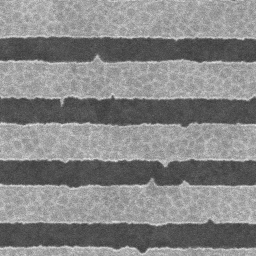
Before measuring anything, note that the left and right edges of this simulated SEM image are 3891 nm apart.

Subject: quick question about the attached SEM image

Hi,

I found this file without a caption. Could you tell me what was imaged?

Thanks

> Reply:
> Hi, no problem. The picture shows one or a few lines or trenches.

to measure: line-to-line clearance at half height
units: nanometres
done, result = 395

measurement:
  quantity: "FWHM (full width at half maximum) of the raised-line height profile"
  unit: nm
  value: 549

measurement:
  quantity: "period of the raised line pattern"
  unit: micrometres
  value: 0.942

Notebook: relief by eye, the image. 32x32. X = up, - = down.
XXXXXXXXXXXXXXXXXXXXXXXXXXXXXXXX
XXXXXXXXXXXXXXXXXXXXXXXXXXXXXXXX
XXXXXXXXXXXXXXXXXXXXXXXXXXXXXXXX
XXXXXXXXXXXXXXXXXXXXXXXXXXXXXXXX
XXXXXXXXXXXXXXXXXXXXXXXXXXXXXXXX
--------------------------------
--------------------------------
------------X---------X---------
XXXXXXXXXXXXXXXXXXXXXXXXXXXXXXXX
XXXXXXXXXXXXXXXXXXXXXXXXXXXXXXXX
XXXXXXXXXXXXXXXXXXXXXXXXXXXXXXXX
XXXXXXXXXXXXXXXXXXXXXXXXXXXXXXXX
-------X------------------------
--------------------------------
--------------------------------
------X-----------------XXXX----
XXXXXXXXXXXXXXXXXXXXXXXXXXXXXXXX
XXXXXXXXXXXXXXXXXXXXXXXXXXXXXXXX
XXXXXXXXXXXXXXXXXXXXXXXXXXXXXXXX
XXXXXXXXXXXXXXXXXXXXXXXXXXXXXXXX
--------------------X-----------
--------------------------------
--------------------------------
XXXXXXXXX-XXXXXXXXXXXXXXXXXXXXXX
XXXXXXXXXXXXXXXXXXXXXXXXXXXXXXXX
XXXXXXXXXXXXXXXXXXXXXXXXXXXXXXXX
XXXXXXXXXXXXXXXXXXXXXXXXXXXXXXXX
XXXXXXXXXXXXXXXXXXXXXXXXXXXXXXXX
--------------------------------
--------------------------------
--------------------------------
XXXXXXXXXXXXXXXXX-XXXXXXXXXXXXXX